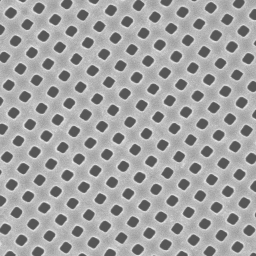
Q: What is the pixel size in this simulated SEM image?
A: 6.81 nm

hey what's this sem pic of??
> a regular array of holes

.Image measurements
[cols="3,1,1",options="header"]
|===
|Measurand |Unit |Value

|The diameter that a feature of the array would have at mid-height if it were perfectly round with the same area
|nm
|73.7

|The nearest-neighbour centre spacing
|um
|0.135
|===